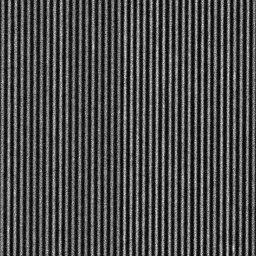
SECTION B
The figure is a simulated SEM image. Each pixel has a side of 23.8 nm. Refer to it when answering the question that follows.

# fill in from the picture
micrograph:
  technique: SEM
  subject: parallel lines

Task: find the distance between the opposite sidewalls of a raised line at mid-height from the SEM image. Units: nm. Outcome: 65.5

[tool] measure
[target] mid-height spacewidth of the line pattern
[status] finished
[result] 89.3 nm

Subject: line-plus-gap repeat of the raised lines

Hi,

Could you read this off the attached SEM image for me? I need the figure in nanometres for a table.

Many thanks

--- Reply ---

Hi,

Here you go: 154